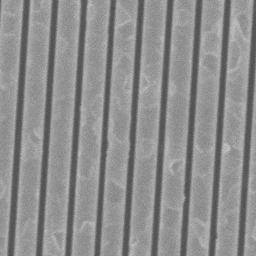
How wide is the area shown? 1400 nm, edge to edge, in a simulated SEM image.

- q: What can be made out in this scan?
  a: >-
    parallel lines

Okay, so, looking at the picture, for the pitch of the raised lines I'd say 157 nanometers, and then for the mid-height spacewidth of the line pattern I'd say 36.8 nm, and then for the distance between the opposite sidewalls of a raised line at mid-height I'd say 0.121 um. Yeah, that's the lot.